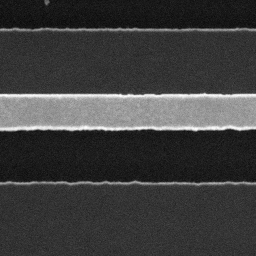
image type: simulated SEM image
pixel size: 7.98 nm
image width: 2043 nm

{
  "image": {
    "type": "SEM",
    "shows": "lines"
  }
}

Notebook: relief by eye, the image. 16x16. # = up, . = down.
................
................
################
################
################
################
################
################
................
................
................
################
################
################
################
################